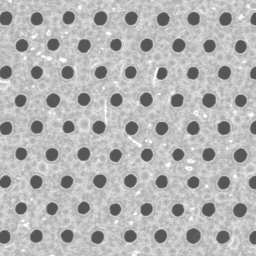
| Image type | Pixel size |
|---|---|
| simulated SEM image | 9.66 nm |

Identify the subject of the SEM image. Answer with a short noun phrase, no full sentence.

a regular array of holes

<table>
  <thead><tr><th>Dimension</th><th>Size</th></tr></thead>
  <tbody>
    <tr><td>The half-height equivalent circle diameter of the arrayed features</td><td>0.126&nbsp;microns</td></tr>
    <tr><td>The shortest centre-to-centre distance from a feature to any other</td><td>293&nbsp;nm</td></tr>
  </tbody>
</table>